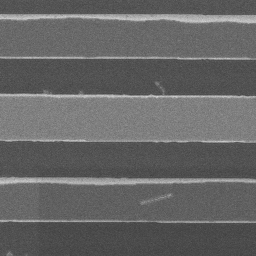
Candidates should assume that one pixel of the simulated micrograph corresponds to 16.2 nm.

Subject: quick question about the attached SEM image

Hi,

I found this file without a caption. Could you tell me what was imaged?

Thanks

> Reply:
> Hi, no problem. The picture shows lines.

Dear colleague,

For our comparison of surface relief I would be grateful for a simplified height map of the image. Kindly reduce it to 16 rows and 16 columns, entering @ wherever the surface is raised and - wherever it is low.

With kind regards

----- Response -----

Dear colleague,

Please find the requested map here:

----------------
@@@@@@@@@@@@@@@@
@@@@@@@@@@@@@@@@
@@@@@@@@@@@@@@@@
----------------
----------------
@@@@@@@@@@@@@@@@
@@@@@@@@@@@@@@@@
@@@@@@@@@@@@@@@@
----------------
----------------
@@@@@@@@@@@@@@@@
@@@@@@@@@@@@@@@@
@@@@@@@@@@@@@@@@
----------------
----------------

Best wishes